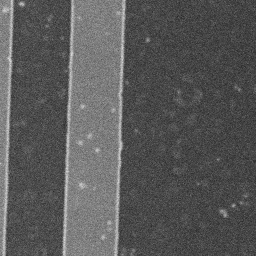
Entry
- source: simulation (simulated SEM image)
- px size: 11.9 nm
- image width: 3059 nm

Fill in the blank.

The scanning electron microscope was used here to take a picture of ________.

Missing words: one or a few lines or trenches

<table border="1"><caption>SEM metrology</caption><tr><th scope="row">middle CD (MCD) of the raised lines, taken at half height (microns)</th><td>0.615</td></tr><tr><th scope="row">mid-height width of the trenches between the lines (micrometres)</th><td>0.715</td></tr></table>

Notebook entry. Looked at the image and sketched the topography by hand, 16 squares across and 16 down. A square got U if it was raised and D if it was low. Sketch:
UDDDDUUUDDDDDDDD
UDDDDUUUDDDDDDDD
UDDDUUUUDDDDDDDD
UDDDUUUUDDDDDDDD
UDDDUUUUDDDDDDDD
UDDDUUUUDDDDDDDD
UDDDUUUUDDDDDDDD
UDDDUUUUDDDDDDDD
UDDDUUUUDDDDDDDD
DDDDUUUUDDDDDDDD
DDDDUUUUDDDDDDDD
DDDDUUUDDDDDDDDD
DDDDUUUDDDDDDDDD
DDDDUUUDDDDDDDDD
DDDDUUUDDDDDDDDD
DDDDUUUDDDDDDDDD